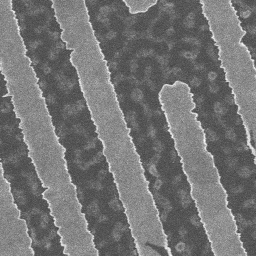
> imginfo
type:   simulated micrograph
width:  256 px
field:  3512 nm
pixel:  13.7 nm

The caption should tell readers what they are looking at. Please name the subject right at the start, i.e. one or a few lines or trenches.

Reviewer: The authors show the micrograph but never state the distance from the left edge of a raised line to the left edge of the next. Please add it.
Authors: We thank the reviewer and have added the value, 944 nm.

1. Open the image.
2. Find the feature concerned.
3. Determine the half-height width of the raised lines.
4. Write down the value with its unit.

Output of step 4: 0.411 microns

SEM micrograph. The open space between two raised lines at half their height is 531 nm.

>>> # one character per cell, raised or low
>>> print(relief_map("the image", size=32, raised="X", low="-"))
X------XXXX-----XXX------XXXX---
XX-----XXXX------X-------XXXX---
XX-----XXXX---------------XXXX--
XX------XXXX--------------XXXX--
XXX-----XXXX---------------XXX--
XXX-----XXXX---------------XXX--
XXX------XXXX--------------XXXX-
XXXX-----XXXX---------------XXXX
XXXX-----XXXX---------------XXXX
XXXXX-----XXXX------------X-XXXX
-XXXX-----XXXX--------X------XXX
-XXXX-----XXXX------XXXX-----XXX
--XXXX-----XXXX-----XXXX-----XXX
--XXXX-----XXXX-----XXXX------XX
--XXXX-----XXXX------XXX------XX
--XXXXX-----XXXX-----XXXX-----X-
---XXXX-----XXXX-----XXXX-------
---XXXX------XXX------XXXX------
----XXXX-----XXXX-----XXXX------
----XXXX-----XXXX-----XXXX------
----XXXX------XXXX-----XXXX-----
-----XXX------XXXX-X---XXXX-----
X----XXXX-----XXXX------XXX-----
X-----XXX------XXXX-----XXXX----
XX---XXXXX-----XXXX-----XXXX----
XX----XXXX-----XXXX-----XXXX----
XX----XXXX------XXXX-----XXXX---
XXX----XXXX-----XXXX-----XXXX---
XXX----XXXX-----XXXX------XXXX--
XXXX---XXXXX-----XXXX-----XXXX--
XXXX----XXXX----------X---XXXX--
XXXX----XXXX-----XX--------XXXX-